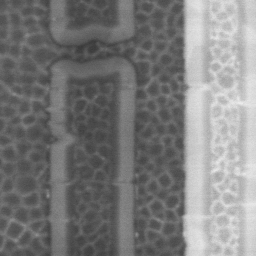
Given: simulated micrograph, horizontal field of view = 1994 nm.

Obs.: one or a few lines or trenches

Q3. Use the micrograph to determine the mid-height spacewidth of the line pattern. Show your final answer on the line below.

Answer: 554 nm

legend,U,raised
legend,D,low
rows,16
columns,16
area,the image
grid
DDDDUUUUDDDDUUUU
DDDDUUUUDDDDUUUU
DDDDDDDDDDDDUUUU
DDDDDDDDDDDDUUUU
DDDDUUUUDDDDUUUU
DDDDUUUUDDDDUUUU
DDDDUUUUDDDDUUUU
DDDDUUUUDDDDUUUU
DDDDUUUUDDDDUUUU
DDDDUUUUDDDDUUUU
DDDDUUUUDDDDUUUU
DDDDUUUUDDDDUUUU
DDDDUUUUDDDDUUUU
DDDDUUUUDDDDUUUU
DDDDUUUUDDDDUUUU
DDDDUUUUDDDDUUUU